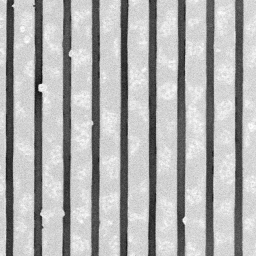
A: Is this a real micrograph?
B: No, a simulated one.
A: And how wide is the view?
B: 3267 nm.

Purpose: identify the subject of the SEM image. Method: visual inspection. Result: parallel lines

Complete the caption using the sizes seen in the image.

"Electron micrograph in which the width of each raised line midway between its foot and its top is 266 nanometres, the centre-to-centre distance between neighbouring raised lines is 365 nm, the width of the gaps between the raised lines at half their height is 97.3 nm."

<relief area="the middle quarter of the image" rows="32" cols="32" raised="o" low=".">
..ooooo..ooooo..ooooo..ooooo..oo
..ooooo..ooooo..ooooo..ooooo..oo
..ooooo..ooooo..ooooo..ooooo..oo
..ooooo..ooooo..ooooo..ooooo..oo
..ooooo..ooooo..ooooo..ooooo..oo
..ooooo..ooooo..ooooo..ooooo..oo
..ooooo..ooooo..ooooo..ooooo..oo
..ooooo..ooooo..ooooo..ooooo..oo
..ooooo..ooooo..ooooo..ooooo..oo
..ooooo..ooooo..ooooo..ooooo..oo
..ooooo..ooooo..ooooo..ooooo...o
..ooooo..ooooo..ooooo..ooooo...o
..ooooo..ooooo..ooooo..ooooo...o
..ooooo..ooooo..ooooo..ooooo...o
..ooooo..ooooo..ooooo..ooooo...o
..ooooo..ooooo..ooooo..ooooo...o
..ooooo..ooooo..ooooo..ooooo...o
..ooooo..ooooo..ooooo..ooooo...o
..ooooo..ooooo..ooooo..ooooo...o
..ooooo..ooooo..ooooo..ooooo...o
..ooooo..ooooo..ooooo..ooooo...o
..ooooo..ooooo..ooooo..ooooo...o
..ooooo..ooooo..ooooo..ooooo...o
..ooooo..ooooo..ooooo..ooooo...o
..ooooo..ooooo..ooooo..ooooo...o
..ooooo..ooooo..ooooo..ooooo...o
..ooooo..ooooo..ooooo..ooooo...o
..ooooo..ooooo..ooooo..ooooo...o
..ooooo..ooooo..ooooo..ooooo..oo
..ooooo..ooooo..ooooo..ooooo..oo
..ooooo..ooooo..ooooo..ooooo..oo
..ooooo..ooooo..ooooo..ooooo..oo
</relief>